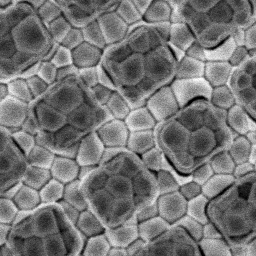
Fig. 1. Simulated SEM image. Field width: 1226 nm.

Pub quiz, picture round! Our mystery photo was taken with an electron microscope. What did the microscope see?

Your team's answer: raised bodies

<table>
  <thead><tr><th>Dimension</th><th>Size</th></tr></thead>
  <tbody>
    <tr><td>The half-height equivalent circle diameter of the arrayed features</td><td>303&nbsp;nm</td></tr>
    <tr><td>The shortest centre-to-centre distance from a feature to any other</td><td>429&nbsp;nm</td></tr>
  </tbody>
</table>